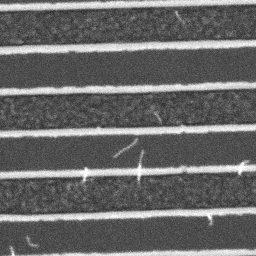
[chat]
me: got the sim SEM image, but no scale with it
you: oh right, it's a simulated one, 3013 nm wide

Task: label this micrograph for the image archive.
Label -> one or a few lines or trenches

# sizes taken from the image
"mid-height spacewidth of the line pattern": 0.469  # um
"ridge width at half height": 0.521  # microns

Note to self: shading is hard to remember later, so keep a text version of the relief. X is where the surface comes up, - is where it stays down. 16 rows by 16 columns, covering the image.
XX--------------
----------------
----------------
XXXXXXXXXXXXXXXX
XXXXXXXXXXXXXXXX
XXXXXXXXXXXXX---
----------------
----------------
XXXXXXXXXXXXXXXX
XXXXXXXXXXXXXXXX
XXXXXXXXXXXXXXXX
----------------
----------------
---XXXXXXXXXXXXX
XXXXXXXXXXXXXXXX
XXXXXXXXXXXXXXXX